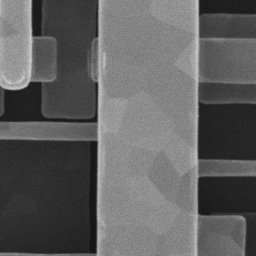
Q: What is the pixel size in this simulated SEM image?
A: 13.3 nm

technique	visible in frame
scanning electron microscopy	wiring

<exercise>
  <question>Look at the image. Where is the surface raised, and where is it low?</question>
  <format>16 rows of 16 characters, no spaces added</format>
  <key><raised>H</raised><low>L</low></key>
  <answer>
HHLLLLHHHHHHLLLL
HHLLLLHHHHHHLLLL
HHLLLLHHHHHHLLLL
HHLLLLHHHHHHLLLL
HHLLLLHHHHHHLLLL
HLLLLLHHHHHHLLLL
LLLLLLHHHHHHLLLL
LLLLLLHHHHHHLLLL
LLLLLLHHHHHHLLLL
LLLLLLHHHHHHLLLL
LLLLLLHHHHHHLLLL
LLLLLLHHHHHHLLLL
LLLLLLHHHHHHLLLL
LLLLLLHHHHHHLLLL
LLLLLLHHHHHHLLLL
LLLLLLHHHHHHLLLL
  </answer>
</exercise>